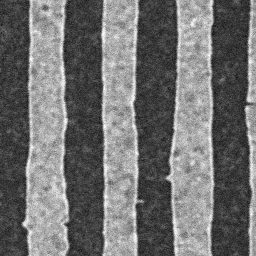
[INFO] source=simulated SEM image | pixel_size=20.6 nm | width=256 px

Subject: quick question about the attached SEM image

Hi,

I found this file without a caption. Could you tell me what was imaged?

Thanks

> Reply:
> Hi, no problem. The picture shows one or a few lines or trenches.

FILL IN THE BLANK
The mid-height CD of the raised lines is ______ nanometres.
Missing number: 680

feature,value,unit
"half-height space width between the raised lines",40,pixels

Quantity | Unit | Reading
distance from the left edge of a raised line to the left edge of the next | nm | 1510